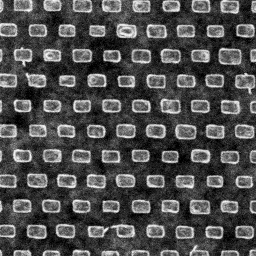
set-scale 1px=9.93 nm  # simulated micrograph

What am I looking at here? a regular array of raised bodies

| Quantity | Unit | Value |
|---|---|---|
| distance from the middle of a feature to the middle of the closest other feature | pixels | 28.7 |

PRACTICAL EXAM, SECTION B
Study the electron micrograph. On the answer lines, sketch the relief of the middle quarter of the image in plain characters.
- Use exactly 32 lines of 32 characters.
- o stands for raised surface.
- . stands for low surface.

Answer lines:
................................
................................
................................
ooo...oooo....ooo....oooo....ooo
ooo...oooo....ooo....oooo....ooo
.......ooo....ooo....oooo....ooo
................................
................................
................................
...ooo....oooo...oooo...ooooo...
...ooo....oooo...oooo....oooo...
...ooo....oooo...oooo....oooo...
................................
................................
................................
o.....oo......ooo....ooo....ooo.
oo....oooo...ooooo...oooo...oooo
oo....oooo...ooooo...oooo...oooo
.............................ooo
................................
................................
................................
..oooo....oooo...oooo....ooo....
..oooo....oooo...oooo....ooo....
..........................oo....
................................
................................
................................
ooo...oooo...oooo....oooo...oooo
ooo...oooo...o.ooo...oooo...oooo
ooo...oooo....ooo.....ooo...oo.o
................................